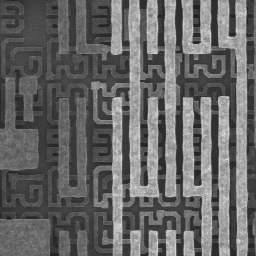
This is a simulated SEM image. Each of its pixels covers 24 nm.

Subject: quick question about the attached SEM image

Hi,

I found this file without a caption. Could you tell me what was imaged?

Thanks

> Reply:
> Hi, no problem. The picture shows wiring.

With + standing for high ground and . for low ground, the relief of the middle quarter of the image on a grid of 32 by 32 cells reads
.................++......+++....
.................++.......++....
.................++.......++....
.................++.......++....
.................++......+++....
.................++......+++....
.................++......+++....
.................++......+++....
+...+........+...++..++..+++..++
+..++.......++...++..++..+++..++
+..++.......++...++..++..+++..++
+..++.......++...++..++..+++..++
+..+++......++...++..+++..++..++
+..+++......+++..++..++...++..++
+..++.......+++..++..++...++..++
+..++.......++..+++..++...++..++
+..++.......++..+++..++...++..++
+..++.......+++.+++..+++..++..++
+..+++......+++.+++..++...++..++
+..+++......++...++..++...++..++
+..+++......++...++..++..+++..++
+..+++......++...++..++...++..++
+..+++......++...++..++..+++..++
+..+++......+++..++..++..+++..++
+..+++......++...++..++...++..++
+...++......++...++..++...++..++
+...++......++...++..++...++..++
+...++......++...++..++...++..++
+...++......++...++..++...++..++
+...++......++...++..++...++..++
+..+++......+++..++..+++..++..++
++++++......+++..+++++++.+++..++